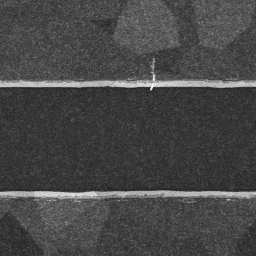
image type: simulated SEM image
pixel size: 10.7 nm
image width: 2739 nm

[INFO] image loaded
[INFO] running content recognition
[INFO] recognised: one or a few lines or trenches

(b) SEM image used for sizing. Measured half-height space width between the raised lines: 110 px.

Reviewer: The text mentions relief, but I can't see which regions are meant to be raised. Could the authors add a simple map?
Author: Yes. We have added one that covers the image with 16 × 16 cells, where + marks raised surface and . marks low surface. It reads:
++++++++++++++++
++++++++++++++++
++++++++++++++++
++++++++++++++++
++++++++++++++++
................
................
................
................
................
................
................
++++++++++++++++
++++++++++++++++
++++++++++++++++
++++++++++++++++